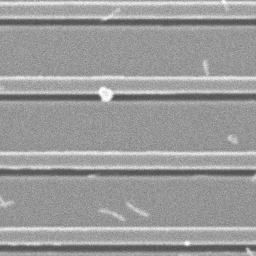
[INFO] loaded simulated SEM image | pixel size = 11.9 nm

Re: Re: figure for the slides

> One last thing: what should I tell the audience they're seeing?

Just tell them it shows lines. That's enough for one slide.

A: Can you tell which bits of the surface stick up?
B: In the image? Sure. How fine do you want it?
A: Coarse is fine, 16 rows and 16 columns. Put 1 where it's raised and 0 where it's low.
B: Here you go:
1111111111111111
1111111111111111
1111111111111111
1111111111111111
1111111111111111
1111111111111111
1111111111111111
1111111111111111
1111111111111111
1111111111111111
1111111111111111
1111111111111111
1111111111111111
1111111111111111
1111111111111111
0000000000000001